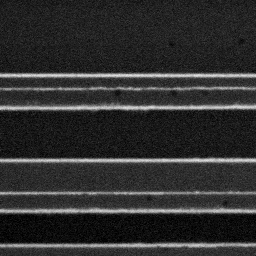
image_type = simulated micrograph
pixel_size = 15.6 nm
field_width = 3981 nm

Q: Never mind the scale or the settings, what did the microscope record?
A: lines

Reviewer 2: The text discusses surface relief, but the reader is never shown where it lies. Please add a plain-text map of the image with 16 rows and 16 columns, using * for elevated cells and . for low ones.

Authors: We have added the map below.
................
................
................
................
................
****************
****************
................
................
................
****************
****************
****************
................
................
****************